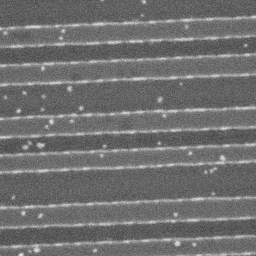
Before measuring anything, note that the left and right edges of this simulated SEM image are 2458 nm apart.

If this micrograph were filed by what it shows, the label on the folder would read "lines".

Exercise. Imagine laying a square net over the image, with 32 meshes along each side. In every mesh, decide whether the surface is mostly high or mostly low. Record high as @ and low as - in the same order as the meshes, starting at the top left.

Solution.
--------------------------------
--------------------------------
-----------------------@@@@@@@@@
-@@@@@@@@@@@@@@@@@@@@@@@@@@@@@@@
@@@@@@@@@@@@@@@@@@@@@@@@@@@@@@@-
@@@@@@@@------------------------
--------------------------------
-----------------@@@@@@@@@@@@@@@
@@@@@@@@@@@@@@@@@@@@@@@@@@@@@@@@
@@@@@@@@@@@@@@@@@@@@@@@@@@@@----
@@@@----------------------------
--------------------------------
--------------------------------
-----------------------------@@@
-------@@@@@@@@@@@@@@@@@@@@@@@@@
@@@@@@@@@@@@@@@@@@@@@@@@@@@@@@@@
@@@@@@@@@@@@@@@@@---------------
--------------------------------
----------------------@@@@@@@@@@
@@@@@@@@@@@@@@@@@@@@@@@@@@@@@@@@
@@@@@@@@@@@@@@@@@@@@@@@@@@------
@@@-----------------------------
--------------------------------
--------------------------------
--------------------------------
-----------@@@@@@@@@@@@@@@@@@@@@
@@@@@@@@@@@@@@@@@@@@@@@@@@@@@@@@
@@@@@@@@@@@@@@@@@@@@@@@@--------
--------------------------------
--------------------------------
---------@@@@@@@@@@@@@@@@@@@@@@@
@@@@@@@@@@@@@@@@@@@@@@@@@@@@@@@@